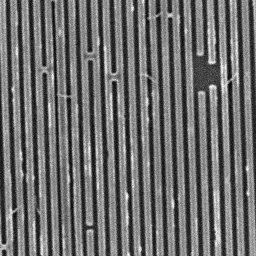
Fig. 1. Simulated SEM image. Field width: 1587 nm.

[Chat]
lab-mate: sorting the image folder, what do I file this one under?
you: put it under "parallel lines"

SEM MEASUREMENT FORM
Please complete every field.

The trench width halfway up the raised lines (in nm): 33.3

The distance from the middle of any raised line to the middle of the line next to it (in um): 0.0716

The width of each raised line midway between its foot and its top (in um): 0.0395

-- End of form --